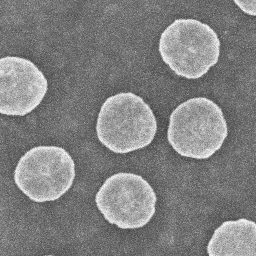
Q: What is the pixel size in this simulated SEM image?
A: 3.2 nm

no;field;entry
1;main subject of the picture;raised bodies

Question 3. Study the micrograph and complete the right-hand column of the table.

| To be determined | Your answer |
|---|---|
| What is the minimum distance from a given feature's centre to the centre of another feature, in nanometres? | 247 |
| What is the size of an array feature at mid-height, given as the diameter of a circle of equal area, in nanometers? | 185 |